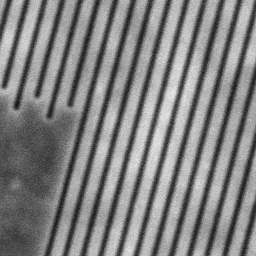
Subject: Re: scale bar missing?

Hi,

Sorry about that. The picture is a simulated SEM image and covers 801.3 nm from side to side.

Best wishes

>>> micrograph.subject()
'parallel lines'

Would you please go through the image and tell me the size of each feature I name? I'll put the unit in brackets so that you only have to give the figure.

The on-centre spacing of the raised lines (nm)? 53.7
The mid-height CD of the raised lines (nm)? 31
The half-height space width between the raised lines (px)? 7.25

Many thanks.